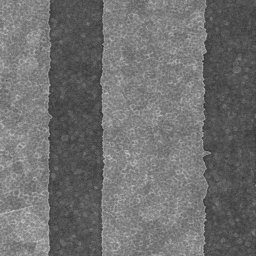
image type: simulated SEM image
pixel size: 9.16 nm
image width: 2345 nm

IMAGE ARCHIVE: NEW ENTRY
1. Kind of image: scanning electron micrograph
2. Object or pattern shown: one or a few lines or trenches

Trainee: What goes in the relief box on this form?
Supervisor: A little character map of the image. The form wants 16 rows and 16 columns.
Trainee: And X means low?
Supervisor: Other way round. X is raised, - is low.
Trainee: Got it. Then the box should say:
XXX---XXXXXXX---
XXX---XXXXXXX---
XXX---XXXXXXX---
XXX---XXXXXXX---
XXX---XXXXXXX---
XXX---XXXXXXX---
XXX---XXXXXXX---
XXX---XXXXXXX---
XXX---XXXXXXX---
XXX---XXXXXXX---
XXX----XXXXXX---
XXX---XXXXXXX---
XXX---XXXXXXX---
XXX---XXXXXXX---
XXX---XXXXXXX---
XXX---XXXXXXX---